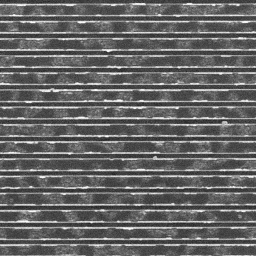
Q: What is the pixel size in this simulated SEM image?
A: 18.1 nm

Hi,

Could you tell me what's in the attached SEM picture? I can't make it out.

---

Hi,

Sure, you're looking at parallel lines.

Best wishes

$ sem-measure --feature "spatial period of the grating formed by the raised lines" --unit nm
312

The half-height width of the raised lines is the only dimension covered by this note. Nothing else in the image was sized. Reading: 222 nanometers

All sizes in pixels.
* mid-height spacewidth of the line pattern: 4.88